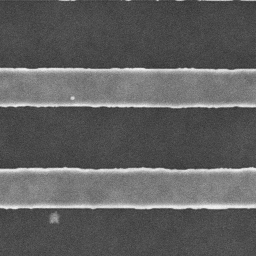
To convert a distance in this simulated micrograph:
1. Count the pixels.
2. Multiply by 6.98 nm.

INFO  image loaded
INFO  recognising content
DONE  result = lines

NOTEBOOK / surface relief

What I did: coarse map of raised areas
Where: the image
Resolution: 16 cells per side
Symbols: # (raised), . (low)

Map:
................
................
................
................
################
################
################
................
................
................
....#...........
################
################
................
................
................